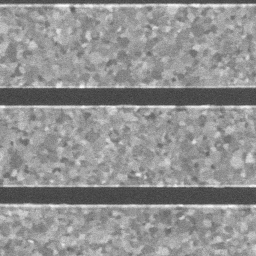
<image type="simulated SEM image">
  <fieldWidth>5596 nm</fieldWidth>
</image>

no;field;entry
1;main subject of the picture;lines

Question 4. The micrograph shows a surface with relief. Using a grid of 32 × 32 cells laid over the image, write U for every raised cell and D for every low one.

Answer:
DDDDDDDDDDDDDDDDDDDDDDDDDDDDDDDD
UUUUUUUUUUUUUUUUUUUUUUUUUUUUUUUU
UUUUUUUUUUUUUUUUUUUUUUUUUUUUUUUU
UUUUUUUUUUUUUUUUUUUUUUUUUUUUUUUU
UUUUUUUUUUUUUUUUUUUUUUUUUUUUUUUU
UUUUUUUUUUUUUUUUUUUUUUUUUUUUUUUU
UUUUUUUUUUUUUUUUUUUUUUUUUUUUUUUU
UUUUUUUUUUUUUUUUUUUUUUUUUUUUUUUU
UUUUUUUUUUUUUUUUUUUUUUUUUUUUUUUU
UUUUUUUUUUUUUUUUUUUUUUUUUUUUUUUU
UUUUUUUUUUUUUUUUUUUUUUUUUUUUUUUU
DDDDDDDDDDDDDDDDDDDDDDDDDDDDDDDD
DDDDDDDDDDDDDDDDDDDDDDDDDDDDDDDD
UUUUUUUUUUUUUUUUUUUUUUUUUUUUUUUU
UUUUUUUUUUUUUUUUUUUUUUUUUUUUUUUU
UUUUUUUUUUUUUUUUUUUUUUUUUUUUUUUU
UUUUUUUUUUUUUUUUUUUUUUUUUUUUUUUU
UUUUUUUUUUUUUUUUUUUUUUUUUUUUUUUU
UUUUUUUUUUUUUUUUUUUUUUUUUUUUUUUU
UUUUUUUUUUUUUUUUUUUUUUUUUUUUUUUU
UUUUUUUUUUUUUUUUUUUUUUUUUUUUUUUU
UUUUUUUUUUUUUUUUUUUUUUUUUUUUUUUU
UUUUUUUUUUUUUUUUUUUUUUUUUUUUUUUU
DDDDDDDDDDDDDDDDDDDDDDDDDDDDDDDD
DDDDDDDDDDDDDDDDDDDDDDDDDDDDDDDD
DDDDDDDDDDDDDDDDDDDDDDDDDDDDDDDD
UUUUUUUUUUUUUUUUUUUUUUUUUUUUUUUU
UUUUUUUUUUUUUUUUUUUUUUUUUUUUUUUU
UUUUUUUUUUUUUUUUUUUUUUUUUUUUUUUU
UUUUUUUUUUUUUUUUUUUUUUUUUUUUUUUU
UUUUUUUUUUUUUUUUUUUUUUUUUUUUUUUU
UUUUUUUUUUUUUUUUUUUUUUUUUUUUUUUU